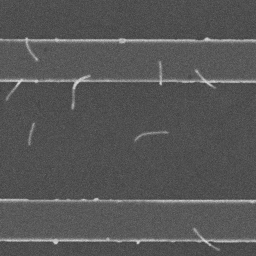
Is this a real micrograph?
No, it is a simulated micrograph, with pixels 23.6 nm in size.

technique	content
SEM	lines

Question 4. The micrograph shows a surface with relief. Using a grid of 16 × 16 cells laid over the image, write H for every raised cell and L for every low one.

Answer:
LLLLLLLLLLLLLLLL
LLLLLLLLLLLLLLLL
HHHHHHHHHHHHHHHH
HHHHHHHHHHHHHHHH
HHHHHHHHHHHHHHHH
LLLLLLLLLLLLLLLL
LLLLLLLLLLLLLLLL
LLLLLLLLLLLLLLLL
LLLLLLLLLLLLLLLL
LLLLLLLLLLLLLLLL
LLLLLLLLLLLLLLLL
LLLLLLLLLLLLLLLL
HHLLLHHLLLLLLLLL
HHHHHHHHHHHHHHHH
HHHHHHHHHHHHHHHH
LLLLLLLLLLLLLLLL